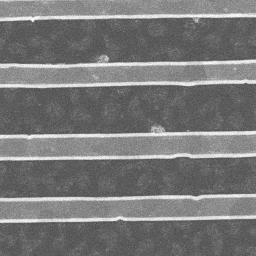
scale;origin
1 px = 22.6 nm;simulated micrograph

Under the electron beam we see one or a few lines or trenches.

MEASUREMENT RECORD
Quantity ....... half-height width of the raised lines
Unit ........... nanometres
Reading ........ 498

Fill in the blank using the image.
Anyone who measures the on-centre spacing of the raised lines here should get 1520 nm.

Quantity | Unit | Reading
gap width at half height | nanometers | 1060